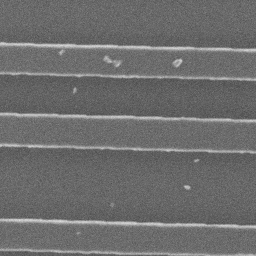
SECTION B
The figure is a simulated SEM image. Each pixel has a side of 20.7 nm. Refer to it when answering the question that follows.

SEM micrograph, lines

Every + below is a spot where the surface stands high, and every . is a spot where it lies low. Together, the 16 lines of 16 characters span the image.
................
................
................
++++++++++++++++
++++++++++++++++
................
................
+++++++++++++++.
++++++++++++++++
...............+
................
................
................
................
++++++++++++++++
++++++++++++++++